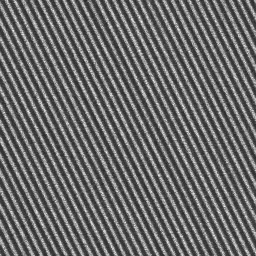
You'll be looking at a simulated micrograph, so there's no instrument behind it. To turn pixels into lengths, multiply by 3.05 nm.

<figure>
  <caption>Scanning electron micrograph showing parallel lines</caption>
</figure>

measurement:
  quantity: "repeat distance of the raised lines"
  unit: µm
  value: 0.0227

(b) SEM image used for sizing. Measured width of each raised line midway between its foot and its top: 11.3 nanometers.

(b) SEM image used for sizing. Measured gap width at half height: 11.3 nm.